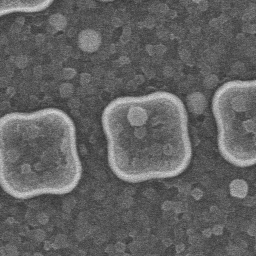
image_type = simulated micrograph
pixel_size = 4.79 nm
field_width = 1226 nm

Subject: raised bodies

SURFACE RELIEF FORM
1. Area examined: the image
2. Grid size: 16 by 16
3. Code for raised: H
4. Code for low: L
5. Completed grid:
HHLLLLLLLLLLLLLL
LLLLLLLLLLLLLLLL
LLLLLLLLLLLLLLLL
LLLLLLLLLLLLLLLL
LLLLLLLLLLLLLLLL
LLLLLLLLLLLLLLHH
LLLLLLLHHHHLLHHH
HHHHLLLHHHHHLLHH
HHHHHLLHHHHHLLHH
HHHHHLLHHHHHLLHH
HHHHHLLHHHHLLLLL
HHHHHLLLLLLLLLLL
LLLLLLLLLLLLLLLL
LLLLLLLLLLLLLLLL
LLLLLLLLLLLLLLLL
LLLLLLLLLLLLLLLL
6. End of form